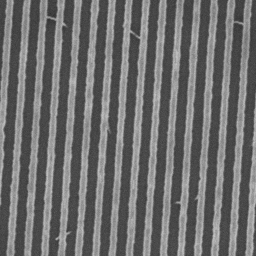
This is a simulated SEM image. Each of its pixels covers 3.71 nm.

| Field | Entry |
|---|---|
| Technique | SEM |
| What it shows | parallel lines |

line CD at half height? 24.5 nm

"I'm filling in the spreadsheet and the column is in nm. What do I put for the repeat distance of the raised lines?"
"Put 63.1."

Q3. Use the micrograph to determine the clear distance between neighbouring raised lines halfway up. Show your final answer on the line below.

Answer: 38.9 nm